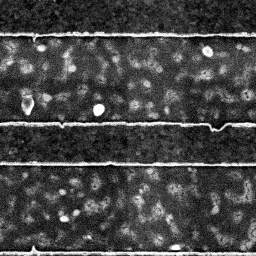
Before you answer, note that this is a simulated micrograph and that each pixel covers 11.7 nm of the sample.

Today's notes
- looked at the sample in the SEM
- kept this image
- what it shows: one or a few lines or trenches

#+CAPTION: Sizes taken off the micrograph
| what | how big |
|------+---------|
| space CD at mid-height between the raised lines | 1030 nm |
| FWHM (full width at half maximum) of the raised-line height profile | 484 nm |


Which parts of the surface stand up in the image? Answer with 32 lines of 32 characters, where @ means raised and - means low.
@@@@@@@@@@@@@@@@@@@@@@@@@@@@@@@@
@@@@@@@@@@@@@@@@@@@@@@@@@@@@@@@@
@@@@@@@@@@@@@@@@@@@@@@@@@@@@@@@@
@@@@@@@@@@@@@@@@@@@@@@@@@@@@@@@@
----@-----------------@@-@-----@
--------------------------------
--------------------------------
--------------------------------
--------------------------------
--------------------------------
--------------------------------
--------------------------------
--------------------------------
---@--------@-------------------
--------------------------------
@@@@@@@-@@-@@@@@@@@@@@@-----@@@@
@@@@@@@@@@@@@@@@@@@@@@@@@@@@@@@@
@@@@@@@@@@@@@@@@@@@@@@@@@@@@@@@@
@@@@@@@@@@@@@@@@@@@@@@@@@@@@@@@@
@@@@@@@@@@@@@@@@@@@@@@@@@@@@@@@@
-@@@@@@@@@@@@@@@@@@@@@@@@@@@@@@@
--------------------------------
--------------------------------
--------------------------------
--------------------------------
--------------------------------
--------------------------------
--------------------------------
--------------------------------
--------------------------------
--------------------------------
----@----------------@----------